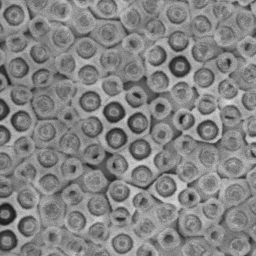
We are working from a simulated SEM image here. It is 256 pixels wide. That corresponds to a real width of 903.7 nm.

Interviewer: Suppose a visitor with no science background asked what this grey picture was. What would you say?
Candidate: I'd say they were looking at a regular array of raised bodies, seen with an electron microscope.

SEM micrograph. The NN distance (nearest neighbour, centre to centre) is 89.2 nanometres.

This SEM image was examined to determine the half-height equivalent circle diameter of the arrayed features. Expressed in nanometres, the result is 51.3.